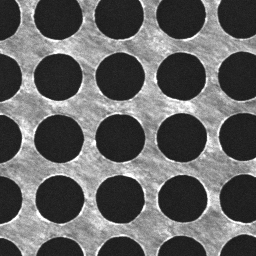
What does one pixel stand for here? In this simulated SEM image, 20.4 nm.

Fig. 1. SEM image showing a regular array of holes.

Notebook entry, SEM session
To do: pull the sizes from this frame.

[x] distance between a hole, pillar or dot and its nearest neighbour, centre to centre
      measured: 1240 nanometres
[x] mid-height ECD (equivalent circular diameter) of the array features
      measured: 49.3 pixels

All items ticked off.